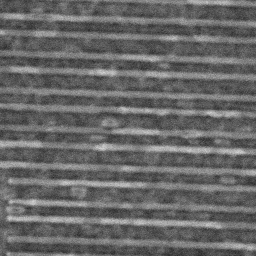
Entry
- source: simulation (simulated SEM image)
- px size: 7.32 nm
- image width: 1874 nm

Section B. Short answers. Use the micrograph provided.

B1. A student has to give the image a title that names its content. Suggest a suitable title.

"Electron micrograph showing parallel lines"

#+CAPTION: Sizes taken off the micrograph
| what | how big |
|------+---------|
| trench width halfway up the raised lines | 0.116 microns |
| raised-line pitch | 136 nm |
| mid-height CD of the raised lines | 33.8 nm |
